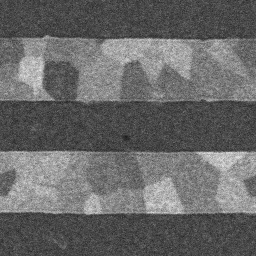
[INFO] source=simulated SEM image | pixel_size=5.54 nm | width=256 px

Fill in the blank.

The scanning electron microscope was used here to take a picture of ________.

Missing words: one or a few lines or trenches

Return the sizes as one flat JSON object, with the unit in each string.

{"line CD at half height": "335 nm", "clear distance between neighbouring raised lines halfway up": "0.288 um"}